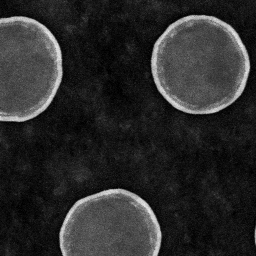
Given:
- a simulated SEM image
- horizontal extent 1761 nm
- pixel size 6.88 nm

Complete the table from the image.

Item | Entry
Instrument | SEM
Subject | raised bodies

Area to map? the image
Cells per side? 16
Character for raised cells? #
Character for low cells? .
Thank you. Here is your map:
................
##.........###..
###.......#####.
####......#####.
####......#####.
####......#####.
###........###..
................
................
................
................
................
.....####.......
....######......
....######......
....######......